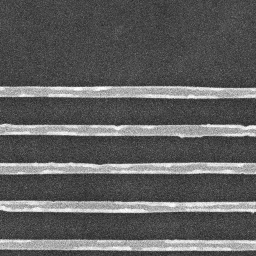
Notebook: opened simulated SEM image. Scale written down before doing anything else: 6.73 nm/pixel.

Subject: parallel lines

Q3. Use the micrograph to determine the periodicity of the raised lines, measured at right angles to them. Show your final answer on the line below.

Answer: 38.2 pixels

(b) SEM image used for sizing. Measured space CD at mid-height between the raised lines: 0.19 microns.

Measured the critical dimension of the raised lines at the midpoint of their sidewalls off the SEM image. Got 69 nanometres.